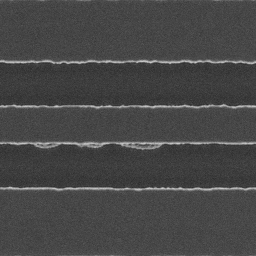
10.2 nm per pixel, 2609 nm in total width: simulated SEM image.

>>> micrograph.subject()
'lines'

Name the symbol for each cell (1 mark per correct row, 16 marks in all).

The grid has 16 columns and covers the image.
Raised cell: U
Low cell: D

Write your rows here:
UUUUUUUUUUUUUUUU
UUUUUUUUUUUUUUUU
UUUUUUUUUUUUUUUU
UUUUUUUUUUUUUUUU
DDDDDDDDDDDDDDDD
DDDDDDDDDDDDDDDD
DDDDDDDDDDDDDDDD
UUUUUUUUUUUUUUUU
UUUUUUUUUUUUUUUU
DDDDDDDDDDDDDDDD
DDDDDDDDDDDDDDDD
DDDDDDDDDDDDDDDD
UUUUUUUUUUUUUUUU
UUUUUUUUUUUUUUUU
UUUUUUUUUUUUUUUU
UUUUUUUUUUUUUUUU